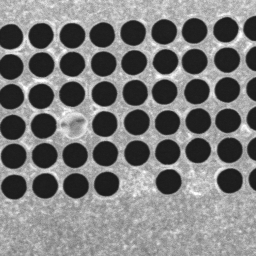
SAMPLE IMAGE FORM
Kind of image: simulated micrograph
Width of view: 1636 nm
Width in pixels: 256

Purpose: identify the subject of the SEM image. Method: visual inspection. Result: a regular array of holes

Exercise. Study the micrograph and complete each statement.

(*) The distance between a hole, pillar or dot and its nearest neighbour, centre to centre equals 189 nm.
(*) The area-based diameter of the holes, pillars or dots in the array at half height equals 163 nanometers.